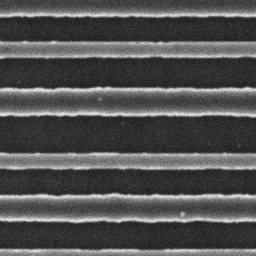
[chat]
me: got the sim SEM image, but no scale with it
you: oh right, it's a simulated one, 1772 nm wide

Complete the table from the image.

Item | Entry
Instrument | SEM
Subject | lines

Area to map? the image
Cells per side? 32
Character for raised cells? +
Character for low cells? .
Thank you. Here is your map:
++++++++++++++++++++++++++++++++
++++++++++++++++++++++++++++++++
................................
................................
................................
++++++++++++++++++++++++++++++++
++++++++++++++++++++++++++++++++
................................
................................
................................
................................
++++++++++++++++++++++++++++++++
++++++++++++++++++++++++++++++++
++++++++++++++++++++++++++++++++
...............................+
................................
................................
................................
................................
++++++++++++++++++++++++++++++++
++++++++++++++++++++++++++++++++
................................
................................
................................
++++++++++++++++++++++++++++++++
++++++++++++++++++++++++++++++++
++++++++++++++++++++++++++++++++
++++++++++++++++++++++++++++++++
................................
................................
................................
++++++++++++++++++++++++++++++++